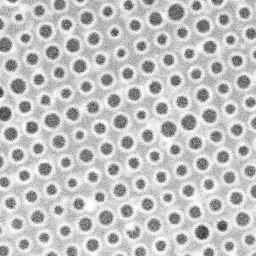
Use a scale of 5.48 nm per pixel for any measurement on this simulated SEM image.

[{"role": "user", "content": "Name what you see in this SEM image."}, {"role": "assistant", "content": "a regular array of holes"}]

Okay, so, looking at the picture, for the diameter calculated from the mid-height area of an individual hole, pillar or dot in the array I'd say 0.0715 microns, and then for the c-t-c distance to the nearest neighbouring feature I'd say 118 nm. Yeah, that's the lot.